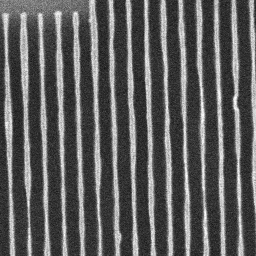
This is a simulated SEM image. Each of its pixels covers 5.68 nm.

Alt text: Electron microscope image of parallel lines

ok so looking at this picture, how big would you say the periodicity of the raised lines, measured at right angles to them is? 0.0998 microns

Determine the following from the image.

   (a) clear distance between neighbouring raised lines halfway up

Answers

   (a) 70.9 nm